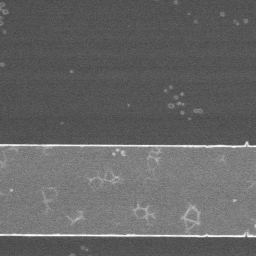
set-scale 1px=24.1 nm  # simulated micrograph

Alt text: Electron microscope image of one or a few lines or trenches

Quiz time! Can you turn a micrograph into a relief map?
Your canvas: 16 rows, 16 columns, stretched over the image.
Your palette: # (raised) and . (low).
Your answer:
................
................
................
................
................
................
................
................
................
################
################
################
################
################
################
................